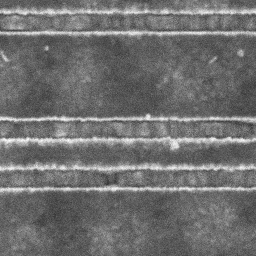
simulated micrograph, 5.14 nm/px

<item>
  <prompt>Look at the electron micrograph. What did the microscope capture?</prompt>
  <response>lines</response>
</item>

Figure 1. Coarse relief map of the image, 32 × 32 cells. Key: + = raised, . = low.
++++++++++++++++++++++++++++++++
+++++++++........+.++.++++++++++
................................
................................
++++++++++++++++++++++++++++++++
++++++++++++++++++++++++++++++++
++++++++++++++++++++++++++++++++
++++++++++++++++++++++++++++++++
++++++++++++++++++++++++++++++++
++++++++++++++++++++++++++++++++
++++++++++++++++++++++++++++++++
++++++++++++++++++++++++++++++++
++++++++++++++++++++++++++++++++
++++++++++++++++++++++++++++++++
++++++++++++++++++++++++++++++++
................................
................................
..++.+++...++....+..+.....+.++++
++++++++++++++++++++++++++++++++
++++++++++++++++++++++++++++++++
++++++++++++++++++++++++++++++++
................................
................................
.....++.......+.+.+....++++++.++
++++++++++++++++++++++++++++++++
++++++++++++++++++++++++++++++++
++++++++++++++++++++++++++++++++
++++++++++++++++++++++++++++++++
++++++++++++++++++++++++++++++++
++++++++++++++++++++++++++++++++
++++++++++++++++++++++++++++++++
++++++++++++++++++++++++++++++++